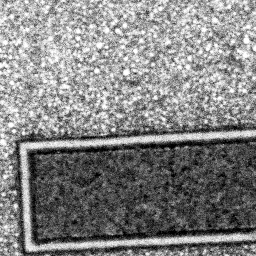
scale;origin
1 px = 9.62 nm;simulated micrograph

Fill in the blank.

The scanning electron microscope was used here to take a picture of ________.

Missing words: one or a few lines or trenches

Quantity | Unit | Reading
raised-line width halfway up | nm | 989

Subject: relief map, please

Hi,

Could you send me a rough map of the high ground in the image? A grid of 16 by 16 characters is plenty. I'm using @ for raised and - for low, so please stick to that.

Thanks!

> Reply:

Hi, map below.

----------------
----------------
----------------
----------------
----------------
----------------
----------------
----------------
-------------@@@
--@@@@@@@@@@@@@@
--@@@@@@@@@@@@@@
--@@@@@@@@@@@@@@
--@@@@@@@@@@@@@@
--@@@@@@@@@@@@@@
--@@@@@@@@@@@@@@
----------------